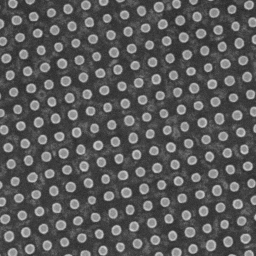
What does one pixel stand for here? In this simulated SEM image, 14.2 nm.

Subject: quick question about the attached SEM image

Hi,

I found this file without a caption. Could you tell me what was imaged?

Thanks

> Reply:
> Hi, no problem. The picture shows a regular array of raised bodies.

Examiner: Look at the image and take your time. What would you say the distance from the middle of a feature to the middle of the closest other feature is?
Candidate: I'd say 245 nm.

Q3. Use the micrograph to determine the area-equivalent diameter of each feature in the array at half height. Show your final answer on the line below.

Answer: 127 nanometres